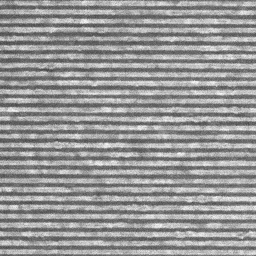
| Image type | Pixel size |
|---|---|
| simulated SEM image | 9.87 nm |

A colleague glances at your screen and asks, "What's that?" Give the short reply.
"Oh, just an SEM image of parallel lines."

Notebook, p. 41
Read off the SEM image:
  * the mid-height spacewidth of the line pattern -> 50.6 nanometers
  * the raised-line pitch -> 0.0877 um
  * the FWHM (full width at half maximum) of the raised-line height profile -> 33.3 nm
